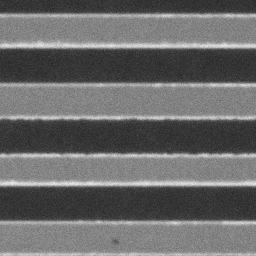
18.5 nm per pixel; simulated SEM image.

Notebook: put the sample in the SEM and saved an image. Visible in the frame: lines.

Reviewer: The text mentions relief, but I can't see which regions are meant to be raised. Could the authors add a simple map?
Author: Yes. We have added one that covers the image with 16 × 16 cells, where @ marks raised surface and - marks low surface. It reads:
----------------
@@@@@@@@@@@@@@@@
@@@@@@@@@@@@@@@@
----------------
----------------
@@@@@@@@@@@@@@@@
@@@@@@@@@@@@@@@@
----------------
----------------
----------------
@@@@@@@@@@@@@@@@
@@@@@@@@@@@@@@@@
----------------
----------------
@@@@@@@@@@@@@@@@
@@@@@@@@@@@@@@@@